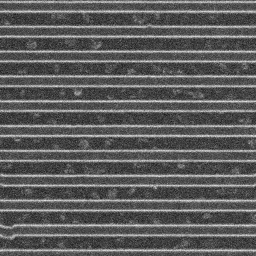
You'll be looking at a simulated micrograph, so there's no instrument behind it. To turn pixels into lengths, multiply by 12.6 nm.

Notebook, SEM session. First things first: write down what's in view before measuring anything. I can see parallel lines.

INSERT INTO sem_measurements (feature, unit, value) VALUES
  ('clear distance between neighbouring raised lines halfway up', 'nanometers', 192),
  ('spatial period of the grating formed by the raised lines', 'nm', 313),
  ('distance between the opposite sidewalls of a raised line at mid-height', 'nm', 121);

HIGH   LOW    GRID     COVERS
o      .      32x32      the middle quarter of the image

................................
................................
................................
oooooooooooooooooooooooooooooooo
oooooooooooooooooooooooooooooooo
................................
................................
................................
................................
oooooooooooooooooooooooooooooooo
oooooooooooooooooooooooooooooooo
oooooooooooooooooooooooooooooooo
................................
................................
................................
................................
oooooooooooooooooooooooooooooooo
oooooooooooooooooooooooooooooooo
................................
................................
................................
................................
oooooooooooooooooooooooooooooooo
oooooooooooooooooooooooooooooooo
................................
................................
................................
................................
oooooooooooooooooooooooooooooooo
oooooooooooooooooooooooooooooooo
......................o.........
................................